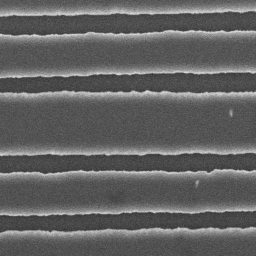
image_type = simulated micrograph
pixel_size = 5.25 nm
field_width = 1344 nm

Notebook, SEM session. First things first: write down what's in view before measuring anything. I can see lines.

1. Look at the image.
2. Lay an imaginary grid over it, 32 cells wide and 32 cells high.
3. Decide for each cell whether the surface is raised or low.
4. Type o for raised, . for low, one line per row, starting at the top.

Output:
oooooooooooooooooooooooooooooooo
ooooooooooooooooooooooooooo.....
................................
................................
oooooooooooooooooooooooooooooooo
oooooooooooooooooooooooooooooooo
oooooooooooooooooooooooooooooooo
oooooooooooooooooooooooooooooooo
oooooooooooooooooooooooooooooooo
ooooooooo.......................
................................
.......oo.........o.............
oooooooooooooooooooooooooooooooo
oooooooooooooooooooooooooooooooo
oooooooooooooooooooooooooooooooo
oooooooooooooooooooooooooooooooo
oooooooooooooooooooooooooooooooo
oooooooooooooooooooooooooooooooo
oooooooooooooooooooooooooooooooo
................................
................................
........ooooooooooooo..ooooooooo
oooooooooooooooooooooooooooooooo
oooooooooooooooooooooooooooooooo
oooooooooooooooooooooooooooooooo
oooooooooooooooooooooooooooooooo
oooooooooooooooo.....oooo.......
................................
................................
oooooooooooooooooooooooooooooooo
oooooooooooooooooooooooooooooooo
oooooooooooooooooooooooooooooooo